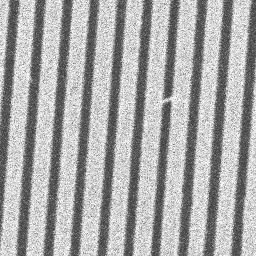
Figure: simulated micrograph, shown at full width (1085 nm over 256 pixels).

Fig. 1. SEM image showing parallel lines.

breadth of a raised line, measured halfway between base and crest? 70.7 nanometres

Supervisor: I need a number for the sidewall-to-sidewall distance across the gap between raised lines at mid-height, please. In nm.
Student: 43.3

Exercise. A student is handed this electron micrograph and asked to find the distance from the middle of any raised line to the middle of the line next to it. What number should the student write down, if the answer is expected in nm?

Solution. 113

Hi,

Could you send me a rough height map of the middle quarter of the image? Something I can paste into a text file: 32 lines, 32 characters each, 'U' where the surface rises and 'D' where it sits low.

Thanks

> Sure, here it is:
DUUUUDDDUUUUDDDUUUDDDUUUUDDDUUUU
DUUUUDDDUUUUDDDUUUDDDUUUUDDDUUUU
DUUUUDDUUUUUDDUUUUDDDUUUUDDDUUUU
DUUUUDDUUUUUDDUUUUDDDUUUUDDDUUUU
DUUUUDDUUUUUDDUUUUDDDUUUUDDDUUUU
DUUUUDDUUUUDDDUUUUDDDUUUUDDUUUUD
DUUUUDDUUUUDDDUUUUDDDUUUUDDUUUUD
DUUUUDDUUUUDDDUUUUDDDUUUUDDUUUUD
UUUUDDDUUUUDDDUUUUDDUUUUDDDUUUUD
UUUUDDDUUUUDDDUUUUDDUUUUUDDUUUUD
UUUUDDDUUUUDDDUUUUDDUUUUUDDUUUUD
UUUUDDDUUUUDDDUUUUDDUUUUDDDUUUUD
UUUUDDDUUUUDDDUUUDDDUUUUDDDUUUUD
UUUUDDDUUUUDDDUUUDDDUUUUDDDUUUUD
UUUUDDDUUUUDDDUUUDDDUUUUDDDUUUUD
UUUUDDUUUUUDDUUUUDDDUUUUDDDUUUUD
UUUUDDUUUUUDDUUUUDDDUUUUDDDUUUUD
UUUUDDUUUUUDDUUUUDDDUUUUDDDUUUUD
UUUDDDUUUUDDDUUUUDDDUUUUDDUUUUDD
UUUDDDUUUUDDDUUUUDDDUUUUDDUUUUDD
UUUDDDUUUUDDDUUUUDDDUUUUDDUUUUDD
UUUDDDUUUUDDDUUUUDDUUUUUDDUUUUDD
UUUDDDUUUUDDDUUUUDDUUUUUDDUUUUDD
UUUDDDUUUUDDDUUUUDDUUUUUDDUUUUDD
UUUDDDUUUUDDDUUUDDDUUUUDDDUUUUDD
UUUDDDUUUUDDDUUUDDDUUUUDDDUUUUDD
UUUDDDUUUUDDDUUUDDDUUUUDDDUUUUDD
UUUDDDUUUUDDDUUUDDDUUUUDDDUUUUDD
UUUDDUUUUUDDUUUUDDDUUUUDDDUUUUDD
UUUDDUUUUUDDUUUUDDDUUUUDDDUUUUDD
UUUDDUUUUUDDUUUUDDDUUUUDDDUUUDDD
UUDDDUUUUDDDUUUUDDDUUUUDDUUUUDDD